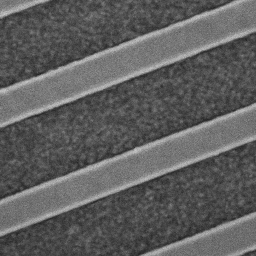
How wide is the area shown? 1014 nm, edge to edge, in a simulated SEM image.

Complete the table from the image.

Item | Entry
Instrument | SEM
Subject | one or a few lines or trenches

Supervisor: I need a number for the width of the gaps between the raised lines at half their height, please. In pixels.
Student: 71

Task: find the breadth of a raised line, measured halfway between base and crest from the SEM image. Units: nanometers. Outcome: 126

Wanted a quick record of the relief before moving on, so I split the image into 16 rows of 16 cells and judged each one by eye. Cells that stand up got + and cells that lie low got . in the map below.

+.............++
...........+++++
........++++++..
......++++++....
...++++++.......
.+++++..........
++++............
+.............++
...........+++++
........++++++..
......+++++.....
...+++++........
++++++..........
+++.............
.............+++
..........++++++